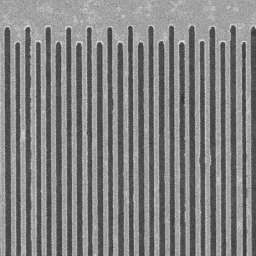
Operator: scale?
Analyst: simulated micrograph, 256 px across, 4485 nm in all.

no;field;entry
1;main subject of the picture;parallel lines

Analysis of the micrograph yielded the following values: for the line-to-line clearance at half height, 103 nm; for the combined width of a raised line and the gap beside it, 179 nanometres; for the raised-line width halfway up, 85.4 nanometres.